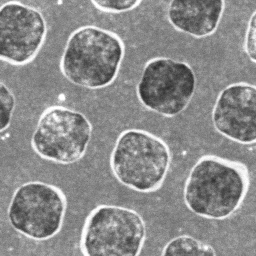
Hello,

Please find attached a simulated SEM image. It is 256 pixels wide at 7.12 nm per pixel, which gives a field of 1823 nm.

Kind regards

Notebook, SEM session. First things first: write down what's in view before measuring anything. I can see holes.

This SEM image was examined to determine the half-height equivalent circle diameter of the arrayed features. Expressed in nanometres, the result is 395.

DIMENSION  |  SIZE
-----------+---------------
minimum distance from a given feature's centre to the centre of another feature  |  563 nm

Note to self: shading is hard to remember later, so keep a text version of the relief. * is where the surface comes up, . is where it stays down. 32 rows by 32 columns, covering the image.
************.....****.......****
.....****************.......****
.....****************......****.
......****************.....****.
.....****.....**********.******.
.....***.......****************.
.....***.......****************.
*...****.......****..***********
********.......***......********
********......****......********
**********...*****......********
.****************.......****....
..****************......***.....
..*****************....****.....
.****.....*****************.....
.****......****************.....
*****......*****.***********....
****.......****....***********..
****.......****......***********
******....****.......***********
**************.......****...****
**************.......***......**
***************.....****.......*
***...***********...***........*
**......***************.......**
*.......****************......**
*.......****....*********....***
*.......***.......**************
**.....****.......**************
****..*****.......**************
***********......****....*******
***********......****......*****